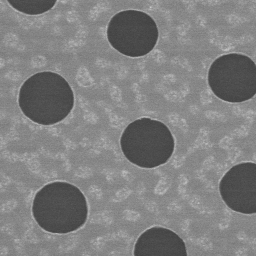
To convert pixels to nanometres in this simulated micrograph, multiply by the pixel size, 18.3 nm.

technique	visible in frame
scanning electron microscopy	holes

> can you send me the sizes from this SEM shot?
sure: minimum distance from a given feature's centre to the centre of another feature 1.99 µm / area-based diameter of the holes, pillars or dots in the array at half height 973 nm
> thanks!